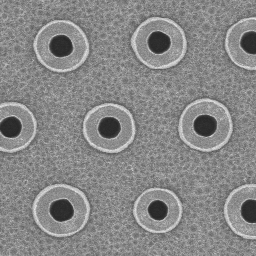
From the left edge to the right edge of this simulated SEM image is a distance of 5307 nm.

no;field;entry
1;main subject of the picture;ring-shaped raised bodies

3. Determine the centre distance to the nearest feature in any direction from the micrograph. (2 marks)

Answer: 1960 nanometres